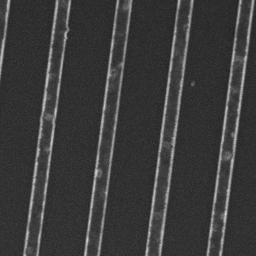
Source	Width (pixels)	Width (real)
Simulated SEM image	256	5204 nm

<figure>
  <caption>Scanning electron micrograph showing parallel lines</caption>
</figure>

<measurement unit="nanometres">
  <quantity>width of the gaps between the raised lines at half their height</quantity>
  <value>955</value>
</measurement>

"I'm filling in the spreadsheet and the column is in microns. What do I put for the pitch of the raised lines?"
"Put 1.23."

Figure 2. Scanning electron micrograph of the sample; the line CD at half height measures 13.8 px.